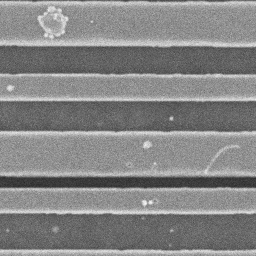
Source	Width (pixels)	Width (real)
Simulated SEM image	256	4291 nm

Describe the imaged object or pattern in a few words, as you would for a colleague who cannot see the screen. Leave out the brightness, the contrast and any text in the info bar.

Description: lines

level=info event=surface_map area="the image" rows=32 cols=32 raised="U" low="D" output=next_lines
UUUUUUUUUUUUUUUUUUUUUUUUUUUUUUUU
UUUUUUUUUUUUUUUUUUUUUUUUUUUUUUUU
UUUUUUUUUUUUUUUUUUUUUUUUUUUUUUUU
UUUUUUUUUUUUUUUUUUUUUUUUUUUUUUUU
UUUUUUUUUUUUUUUUUUUUUUUUUUUUUUUU
UUUUUUUUUUUUUUUUUUUUUUUUUUUUUUUU
DDDDDDDDDDDDDDDDDDDDDDDDDDDDDDDD
DDDDDDDDDDDDDDDDDDDDDDDDDDDDDDDD
DDDDDDDDDDDDDDDDDDDDDDDDDDDDDDDD
UUUUUUUUUUUUUUUUUUUUUUUUUUUUUUUU
UUUUUUUUUUUUUUUUUUUUUUUUUUUUUUUU
UUUUUUUUUUUUUUUUUUUUUUUUUUUUUUUU
UUUUUUUUUUUUUUUUUUUUUUUUUUUUUUUU
DDDDDDDDDDDDDDDDDDDDDDDDDDDDDDDD
DDDDDDDDDDDDDDDDDDDDDDDDDDDDDDDD
DDDDDDDDDDDDDDDDDDDDDDDDDDDDDDDD
UUUUUUUUUUUUUUUUUUUUUUUUUUUDDDUU
UUUUUUUUUUUUUUUUUUUUUUUUUUUUUUUU
UUUUUUUUUUUUUUUUUUUUUUUUUUUUUUUU
UUUUUUUUUUUUUUUUUUUUUUUUUUUUUUUU
UUUUUUUUUUUUUUUUUUUUUUUUUUUUUUUU
UUUUUUUUUUUUUUUUUUUUUUUUUUUUUUUU
DDDDDDDDDDDDDDDDDDDDDDDDDDDDDDDD
DDDDDDDDDDDDDDDDDDDDDDUUDDDDUDDD
UUUUUUUUUUUUUUUUUUUUUUUUUUUUUUUU
UUUUUUUUUUUUUUUUUUUUUUUUUUUUUUUU
UUUUUUUUUUUUUUUUUUUUUUUUUUUUUUUU
DDDDDDDDDDDDDDDDDDDDDDDDDDDDDDDD
DDDDDDDDDDDDDDDDDDDDDDDDDDDDDDDD
DDDDDDDDDDDDDDDDDDDDDDDDDDDDDDDD
DDDDDDDDDDDDDDDDDDDDDDDDDDDDDDDD
UUUUUUUUUUUUUUUUUUUUUUUUUUUUUUUU